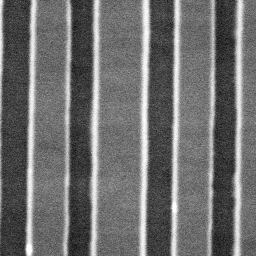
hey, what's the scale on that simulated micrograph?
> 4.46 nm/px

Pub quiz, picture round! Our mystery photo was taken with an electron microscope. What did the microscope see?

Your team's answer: lines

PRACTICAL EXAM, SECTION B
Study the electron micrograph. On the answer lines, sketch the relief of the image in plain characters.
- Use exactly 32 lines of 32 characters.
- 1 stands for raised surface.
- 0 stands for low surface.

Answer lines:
00001111100011111100001111100011
00001111100011111100001111100011
00001111100011111100001111100011
00001111100011111100001111100011
00001111100011111100001111100011
00001111100011111100001111100011
00001111100011111100001111100011
00001111100011111100001111100011
00001111100011111100001111100011
00001111100011111100001111100011
00001111100011111100001111100011
00001111100011111100001111100011
00001111100011111100001111100011
00001111100011111100001111100011
00001111100011111100001111100011
00001111100011111100001111100011
00001111100011111100001111000011
00001111100011111100001111000011
00001111100011111100001111000011
00001111100011111100001111000011
00001111100011111100001111000011
00001111100011111100001111000011
00001111000011111100001111000011
00001111000011111100001111000011
00001111000011111100001111000011
00001111000011111100001111000011
00001111000011111100001111000011
00001111000011111100001111000011
00001111000011111100001111000011
00001111000011111100001111000011
00011111000011111100001111000011
00011111000011111100001111000011